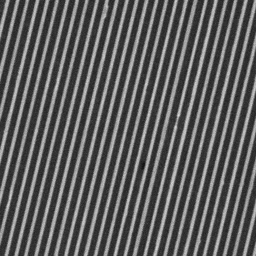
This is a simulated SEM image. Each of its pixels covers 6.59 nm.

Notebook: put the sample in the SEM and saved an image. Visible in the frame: parallel lines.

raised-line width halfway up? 17.6 nm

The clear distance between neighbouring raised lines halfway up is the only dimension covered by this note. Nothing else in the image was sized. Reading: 0.0473 microns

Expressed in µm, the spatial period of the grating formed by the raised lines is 0.0635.